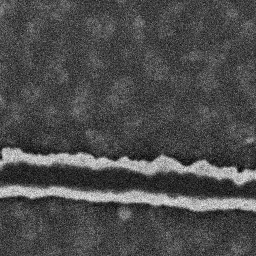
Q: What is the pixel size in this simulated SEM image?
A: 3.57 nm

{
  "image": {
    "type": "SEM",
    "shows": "one or a few lines or trenches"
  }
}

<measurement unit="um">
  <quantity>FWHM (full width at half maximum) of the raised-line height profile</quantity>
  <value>0.127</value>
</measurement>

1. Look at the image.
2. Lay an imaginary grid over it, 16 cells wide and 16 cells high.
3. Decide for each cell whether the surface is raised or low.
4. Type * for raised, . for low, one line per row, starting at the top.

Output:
................
................
................
................
................
................
................
................
................
................
*************...
****************
.........*******
................
................
................